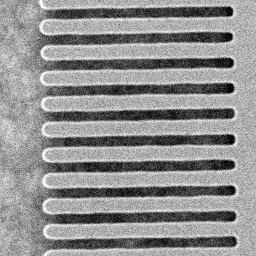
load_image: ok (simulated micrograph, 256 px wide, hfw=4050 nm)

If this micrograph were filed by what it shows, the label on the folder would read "groups of lines, slits or small figures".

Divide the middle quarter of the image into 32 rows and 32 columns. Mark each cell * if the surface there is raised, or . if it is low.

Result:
................................
........................********
********************************
********************************
******************************..
................................
................................
................................
********************************
********************************
********************************
***.*****.......................
................................
................................
.........***..**..**************
********************************
********************************
*************************.......
................................
................................
..............................**
********************************
********************************
********************************
................................
................................
................................
********************************
********************************
********************************
******************..............
................................